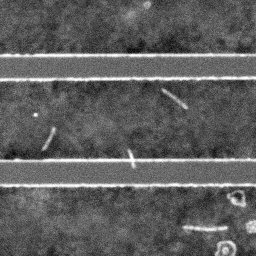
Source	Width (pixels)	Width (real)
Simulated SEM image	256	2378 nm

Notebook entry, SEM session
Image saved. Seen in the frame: lines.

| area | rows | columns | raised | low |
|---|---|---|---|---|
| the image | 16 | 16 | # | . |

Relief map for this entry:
................
................
................
################
################
................
................
................
................
................
################
################
................
................
................
................